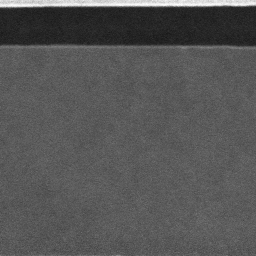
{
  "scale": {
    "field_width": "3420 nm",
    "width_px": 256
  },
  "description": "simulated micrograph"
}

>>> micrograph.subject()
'lines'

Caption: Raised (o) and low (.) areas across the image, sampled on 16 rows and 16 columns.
................
................
................
oooooooooooooooo
oooooooooooooooo
oooooooooooooooo
oooooooooooooooo
oooooooooooooooo
oooooooooooooooo
oooooooooooooooo
oooooooooooooooo
oooooooooooooooo
oooooooooooooooo
oooooooooooooooo
oooooooooooooooo
oooooooooooooooo